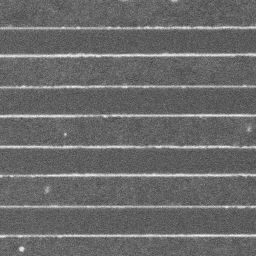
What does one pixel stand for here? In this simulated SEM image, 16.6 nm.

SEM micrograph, lines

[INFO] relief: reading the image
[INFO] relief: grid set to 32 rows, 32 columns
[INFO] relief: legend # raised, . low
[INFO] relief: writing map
................................
................................
................................
.........#...##..###.##.##.#####
################################
################################
################################
................................
................................
................................
................................
################################
################################
################################
#######.#.......................
................................
................................
................................
################################
################################
################################
################################
................................
................................
................................
................................
################################
################################
################################
................................
................................
................................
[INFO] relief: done